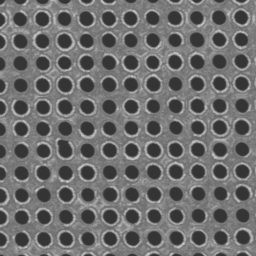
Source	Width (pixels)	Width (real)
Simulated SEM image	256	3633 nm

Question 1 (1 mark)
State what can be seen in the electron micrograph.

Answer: a regular array of holes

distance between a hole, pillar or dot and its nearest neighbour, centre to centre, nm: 310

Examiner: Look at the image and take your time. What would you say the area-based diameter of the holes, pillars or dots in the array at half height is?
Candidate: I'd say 197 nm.